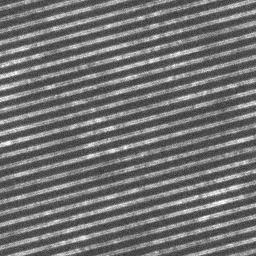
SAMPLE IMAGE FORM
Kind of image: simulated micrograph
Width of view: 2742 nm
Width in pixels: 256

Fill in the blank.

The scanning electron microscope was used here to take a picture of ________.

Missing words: parallel lines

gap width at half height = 0.0817 um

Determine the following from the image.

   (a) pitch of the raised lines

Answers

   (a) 0.118 micrometres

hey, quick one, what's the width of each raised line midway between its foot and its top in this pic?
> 0.0415 µm